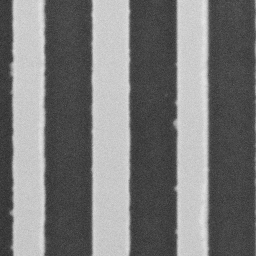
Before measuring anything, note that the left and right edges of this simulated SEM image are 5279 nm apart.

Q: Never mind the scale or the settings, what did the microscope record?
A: lines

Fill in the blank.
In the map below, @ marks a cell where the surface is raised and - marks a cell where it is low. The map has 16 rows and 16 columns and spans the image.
-@@---@@---@@---
-@@---@@---@@---
-@@---@@---@@---
-@@---@@---@@---
-@@---@@---@@---
-@@---@@---@@---
-@@---@@---@@---
-@@---@@---@@---
-@@---@@---@@---
-@@---@@---@@---
-@@---@@---@@---
-@@---@@---@@---
-@@---@@---@@---
-@@---@@---@@---
-@@---@@---@@---
-@@---@@---@@---